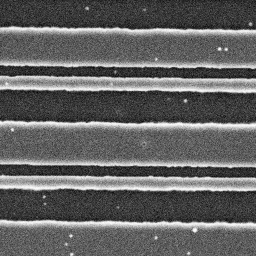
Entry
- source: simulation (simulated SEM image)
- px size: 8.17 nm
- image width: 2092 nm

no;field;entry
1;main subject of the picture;lines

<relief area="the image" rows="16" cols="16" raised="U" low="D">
DDDDDDDDDDDDDDDD
DDDDDDDDDDDDDDDD
UUUUUUUUUUUUUUUU
UUUUUUUUUUUUUUUU
UUUUUUUUUUUUUUUU
UUUUUUUUUUUUUUUU
DDDDDDDDDDDDDDDD
DDDDDDDDDDDDDDDD
UUUUUUUUUUUUUUUU
UUUUUUUUUUUUUUUU
UUUUUUUUUUUUUUUU
UUUUUUUUUUUUUUUU
DDDDDDDDDDDDDDDD
DDDDDDDDDDDDDDDD
UUUUUUUUUUUUUUUU
UUUUUUUUUUUUUUUU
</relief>